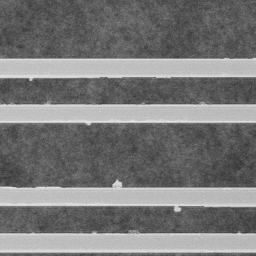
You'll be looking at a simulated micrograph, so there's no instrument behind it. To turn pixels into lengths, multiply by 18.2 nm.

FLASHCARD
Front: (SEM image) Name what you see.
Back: lines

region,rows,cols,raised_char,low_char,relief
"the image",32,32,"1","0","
00000000000000000000000000000000
00000000000000000000000000000000
00000000000000000000000000000000
00000000000000000000000000000000
00000000000000000000000000000000
00000000000000000000000000000000
00000000000000000000000000000000
11111111111111111111111111111111
11111111111111111111111111111111
11111111111111111111111111111111
00000000000000000000000000000000
00000000000000000000000000000000
00000000000000000000000000000000
11111111111111111111111111111111
11111111111111111111111111111111
00000000000000000000000000000000
00000000000000000000000000000000
00000000000000000000000000000000
00000000000000000000000000000000
00000000000000000000000000000000
00000000000000000000000000000000
00000000000000000000000000000000
00000000000000000000000000000000
11000000000000110000000000000000
11111111111111111111111111111111
11111111111111111111111111111111
00000000000000000000000000000000
00000000000000000000000000000000
00000000000000000000000000000000
11111111111111111111111111111111
11111111111111111111111111111111
00000000000000000000000000000000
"